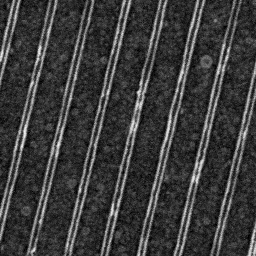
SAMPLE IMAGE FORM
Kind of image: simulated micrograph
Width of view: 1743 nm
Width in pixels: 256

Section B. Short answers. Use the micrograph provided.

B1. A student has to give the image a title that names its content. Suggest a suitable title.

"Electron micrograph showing parallel lines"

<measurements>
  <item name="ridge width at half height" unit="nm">43.1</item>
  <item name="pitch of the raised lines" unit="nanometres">244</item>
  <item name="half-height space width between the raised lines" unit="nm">200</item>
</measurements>